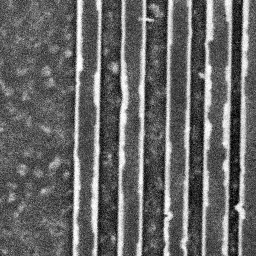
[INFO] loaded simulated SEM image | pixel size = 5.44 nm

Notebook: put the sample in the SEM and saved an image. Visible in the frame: parallel lines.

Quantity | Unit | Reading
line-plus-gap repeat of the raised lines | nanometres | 235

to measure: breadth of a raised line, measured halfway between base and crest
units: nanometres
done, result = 119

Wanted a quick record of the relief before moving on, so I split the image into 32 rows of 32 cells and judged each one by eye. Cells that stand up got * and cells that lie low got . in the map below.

..........***..***...***..***..*
..........***..***...***..***..*
..........**...***...***..***..*
..........**...***...***..***.**
..........**...***...***..***.**
..........**...***...***..***.**
..........**...***...***..***.**
..........**...***...***..***.**
..........**...***...***..***.**
..........**...***...***..***.**
..........**...***...**...***.**
..........**...***...**...***.**
..........**...***...**...***.**
..........**...***...**...***.**
..........**...***...***..***.**
..........**...***...***..***.**
..........**...***...***..**..**
..........**...***...**...**..**
.........***...***...**...**..**
.........***...***...**...**..**
..........**...***...**...**..**
..........**...***...**...**..**
..........**...***...**...**..**
..........**...***...**...**..**
.........***...***...**...**..**
.........***...***...**...**..**
.........***...***...**...**..**
.........***...***...**...**..**
.........***...**....**...**..**
.........***...**....**...**..**
.........***...**....**...**..**
.........***...**....**..***..**